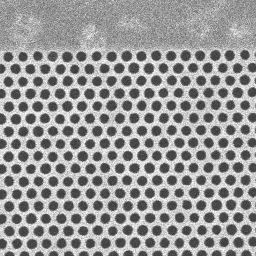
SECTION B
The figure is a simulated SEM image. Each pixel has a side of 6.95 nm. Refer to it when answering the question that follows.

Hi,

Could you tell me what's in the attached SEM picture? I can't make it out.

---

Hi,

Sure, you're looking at a regular array of holes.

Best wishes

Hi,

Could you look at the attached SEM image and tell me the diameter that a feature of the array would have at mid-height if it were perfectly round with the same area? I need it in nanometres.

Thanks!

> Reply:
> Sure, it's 72.7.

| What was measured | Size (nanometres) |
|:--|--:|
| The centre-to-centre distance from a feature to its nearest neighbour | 97.8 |